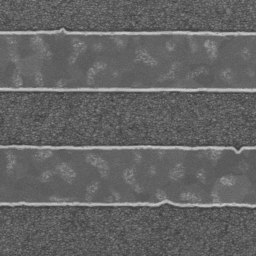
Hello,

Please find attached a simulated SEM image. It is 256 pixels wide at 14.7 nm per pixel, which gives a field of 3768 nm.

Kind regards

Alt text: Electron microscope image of one or a few lines or trenches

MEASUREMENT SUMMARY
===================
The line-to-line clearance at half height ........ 853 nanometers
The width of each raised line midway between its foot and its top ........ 839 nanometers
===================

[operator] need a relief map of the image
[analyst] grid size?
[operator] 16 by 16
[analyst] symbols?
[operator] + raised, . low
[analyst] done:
................
................
++++++++++++++++
++++++++++++++++
++++++++++++++++
++++++++++++++++
................
................
................
++++++++++++++++
++++++++++++++++
++++++++++++++++
++++++++++++++++
................
................
................